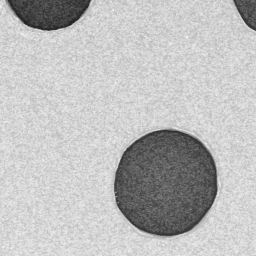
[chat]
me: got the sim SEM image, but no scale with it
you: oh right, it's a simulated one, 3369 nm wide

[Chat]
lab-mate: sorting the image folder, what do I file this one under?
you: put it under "holes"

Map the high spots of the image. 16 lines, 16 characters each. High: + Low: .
+....++++++++++.
++..+++++++++++.
++++++++++++++++
++++++++++++++++
++++++++++++++++
++++++++++++++++
++++++++++++++++
++++++++++++++++
+++++++++...++++
++++++++.....+++
+++++++......+++
+++++++.......++
+++++++......+++
++++++++.....+++
+++++++++...++++
++++++++++++++++